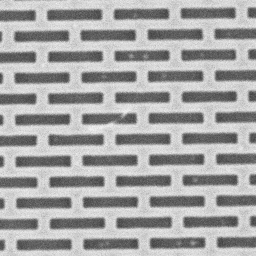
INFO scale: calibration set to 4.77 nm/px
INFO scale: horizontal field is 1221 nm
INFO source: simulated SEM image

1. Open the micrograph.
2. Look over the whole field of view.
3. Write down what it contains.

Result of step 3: groups of lines, slits or small figures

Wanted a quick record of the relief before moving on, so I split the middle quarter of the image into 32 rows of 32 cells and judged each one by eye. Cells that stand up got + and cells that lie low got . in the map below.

++++++++++++++++++++++++++++++++
++++++++++++++++++++++++++......
..++..............+++...........
..++..............+++...........
.+++..............+++...........
++++++++++++++++++++++++++++++++
++++++++++++++++++++++++++++++++
..........+++..............++...
..........++...............++...
..........+++..............++...
++++++++++++++++++++++++++++++++
++++++++++++++++++++++++++++++++
..++..............+++...........
..++..............+++...........
..++...............++...........
.+++++++++++++++++++++++++++++++
++++++++++++++++++++++++++++++++
..........+++..............++...
..........+++..............++...
..........+++..............++...
....++++++++++++++++++++++++++++
++++++++++++++++++++++++++++++++
+++++++++++++.....++++..........
..++...............++...........
..++...............++...........
..+++.............++++...+++++++
++++++++++++++++++++++++++++++++
++++++++++++++++++++++++++++++++
..........+++..............++...
..........+++..............++...
..........+++..............+++..
++++++++++++++++++++++++++++++++